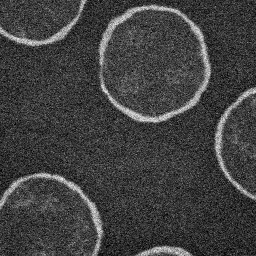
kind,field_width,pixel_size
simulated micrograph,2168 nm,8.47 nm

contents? raised bodies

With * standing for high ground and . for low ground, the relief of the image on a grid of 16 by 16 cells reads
*****....*......
****...*****....
.**....******...
......*******...
......*******...
......*******...
.......*****...*
..............**
..............**
..............**
..............**
.***...........*
*****...........
******..........
******..........
******..........